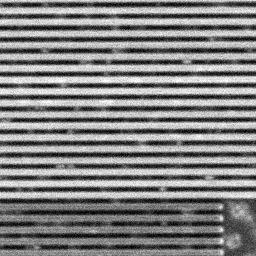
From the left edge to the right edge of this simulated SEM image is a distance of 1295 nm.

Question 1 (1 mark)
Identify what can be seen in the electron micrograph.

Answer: parallel lines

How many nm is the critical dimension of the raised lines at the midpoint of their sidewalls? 22.1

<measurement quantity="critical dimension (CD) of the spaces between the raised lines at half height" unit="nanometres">36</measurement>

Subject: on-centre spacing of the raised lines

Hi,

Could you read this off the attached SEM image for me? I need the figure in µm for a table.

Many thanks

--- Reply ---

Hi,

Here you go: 0.0584